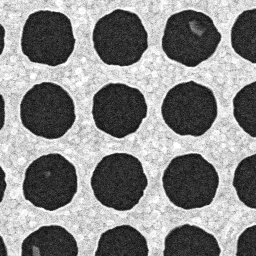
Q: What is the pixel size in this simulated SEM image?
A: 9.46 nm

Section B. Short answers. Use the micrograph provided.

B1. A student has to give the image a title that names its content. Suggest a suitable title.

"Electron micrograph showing a regular array of holes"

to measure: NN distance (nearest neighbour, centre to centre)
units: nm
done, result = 669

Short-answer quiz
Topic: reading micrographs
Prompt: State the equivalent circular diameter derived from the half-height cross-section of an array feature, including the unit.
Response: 530 nanometers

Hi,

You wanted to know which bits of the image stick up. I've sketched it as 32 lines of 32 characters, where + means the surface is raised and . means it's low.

++++++++++++++++++++++++++++++++
++++...+++++++..++++++...+++++..
+++......+++......+++......++...
+++......+++......+++......++...
.++......++.......++........+...
.++......+++.......+.......++...
+++......+++......+++......++...
++++....+++++....+++++....+++++.
++++++++++++++++++++++++++++++++
++++++++++++++++++++++++++++++++
+++++..++++++...++++++...++++++.
+++.....++++......+++......+++..
.++......+++......++.......++...
.+.......+++......++.......++...
.++......+++......++.......++...
.++......+++......+++......+++..
++++....+++++....+++++....+++++.
++++++++++++++++++++++++++++++++
++++++++++++++++++++++++++++++++
+++++...+++++....+++++...++++++.
++++.....+++......+++.....++++..
.++.......++......++.......++...
.++.......+.......++.......++...
.++.......+.......++.......++...
+++......+++......+++......+++..
++++....+++++....+++++....+++++.
++++++++++++++++++++++++++++++++
++++++++++++++++++++++++++++++++
+++++...++++++...+++++...++++++.
+++......++++.....+++......+++..
.++.......++......+++......+++..
.++.......++.......+.......++...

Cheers